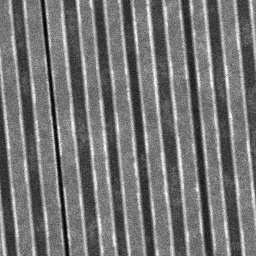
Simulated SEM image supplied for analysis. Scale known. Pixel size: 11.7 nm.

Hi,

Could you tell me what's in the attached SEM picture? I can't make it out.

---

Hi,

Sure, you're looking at parallel lines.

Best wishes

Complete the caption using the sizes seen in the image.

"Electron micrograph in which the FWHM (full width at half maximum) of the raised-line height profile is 0.197 microns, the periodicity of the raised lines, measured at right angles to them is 0.327 um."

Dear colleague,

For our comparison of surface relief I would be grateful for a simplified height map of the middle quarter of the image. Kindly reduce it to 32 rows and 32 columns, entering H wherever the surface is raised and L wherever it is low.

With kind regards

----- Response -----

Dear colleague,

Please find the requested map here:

HLLLLHHHLLLLHHHHLLLHHHHLLLLHHHHL
HLLLLHHHHLLLHHHHLLLHHHHLLLLHHHHL
HLLLLHHHHLLLHHHHLLLHHHHLLLLHHHHL
HLLLLHHHHLLLHHHHLLLHHHHLLLLHHHHL
HLLLLHHHHLLLHHHHLLLHHHHLLLLHHHHL
HHLLLHHHHLLLHHHHLLLHHHHLLLLHHHHL
HHLLLHHHHLLLHHHHLLLHHHHLLLLHHHHL
HHLLLLHHHLLLHHHHLLLHHHHLLLLHHHHL
HHLLLLHHHLLLHHHHLLLHHHHLLLLHHHHL
HHLLLLHHHHLLHHHHHLLHHHHLLLLHHHHL
HHLLLLHHHHLLLHHHHLLLHHHHLLLLHHHH
HHLLLLHHHHLLLHHHHLLLHHHHLLLLHHHH
HHLLLLHHHHLLLHHHHLLLHHHHLLLLHHHH
HHLLLLHHHHLLLHHHHLLLHHHHLLLLHHHH
HHLLLLHHHHLLLHHHHLLLHHHHLLLLHHHH
HHLLLLHHHHLLLHHHHLLLHHHHLLLLHHHH
HHLLLLHHHHLLLHHHHLLLHHHHLLLLHHHH
HHHLLLLHHHLLLHHHHLLLHHHHLLLLHHHH
HHHLLLLHHHLLLHHHHHLLHHHHLLLLHHHH
HHHLLLLHHHHLLHHHHHLLHHHHLLLLHHHH
HHHLLLLHHHHLLLHHHHLLHHHHHLLLLHHH
HHHLLLLHHHHLLLHHHHLLLHHHHLLLLHHH
HHHLLLLHHHHLLLHHHHLLLHHHHLLLLHHH
HHHLLLLHHHHLLLHHHHLLLHHHHLLLLHHH
HHHLLLLHHHHLLLHHHHLLLHHHHLLLLHHH
HHHHLLLHHHHLLLHHHHLLLHHHHLLLLHHH
HHHHLLLHHHHLLLHHHHLLLHHHHLLLLHHH
HHHHLLLHHHHLLLHHHHLLLHHHHLLLLHHH
HHHHLLLLHHHLLLHHHHHLLHHHHLLLLHHH
HHHHLLLLHHHLLLHHHHHLLHHHHLLLLHHH
HHHHLLLLHHHLLLLHHHHLLHHHHHLLLHHH
HHHHLLLLHHHLLLLHHHHLLLHHHHLLLLHH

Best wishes